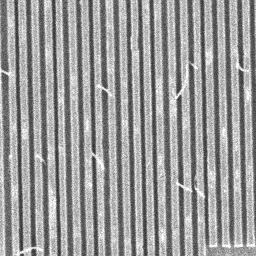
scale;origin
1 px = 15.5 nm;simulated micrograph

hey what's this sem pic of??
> parallel lines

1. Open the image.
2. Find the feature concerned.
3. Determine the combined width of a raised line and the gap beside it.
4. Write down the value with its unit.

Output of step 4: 192 nm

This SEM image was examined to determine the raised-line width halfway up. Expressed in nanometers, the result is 110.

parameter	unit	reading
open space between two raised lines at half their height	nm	83.3